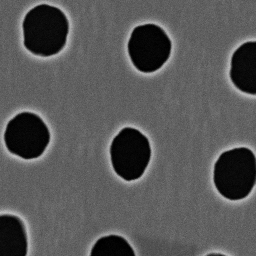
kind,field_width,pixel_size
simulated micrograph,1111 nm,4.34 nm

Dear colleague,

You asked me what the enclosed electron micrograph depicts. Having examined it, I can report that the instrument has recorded holes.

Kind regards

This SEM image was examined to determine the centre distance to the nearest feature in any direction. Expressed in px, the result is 105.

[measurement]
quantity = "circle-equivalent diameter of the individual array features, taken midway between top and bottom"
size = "197 nanometers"